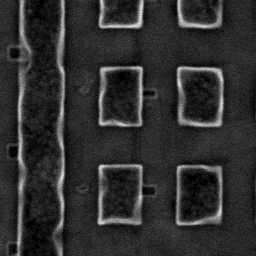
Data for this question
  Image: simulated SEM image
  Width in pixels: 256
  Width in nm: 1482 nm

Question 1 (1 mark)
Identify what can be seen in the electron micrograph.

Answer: wiring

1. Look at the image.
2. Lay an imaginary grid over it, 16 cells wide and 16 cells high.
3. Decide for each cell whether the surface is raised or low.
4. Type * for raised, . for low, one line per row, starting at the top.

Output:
.***..***..***..
.***...**...*...
.***............
..**............
.***...**..***..
.***..***..***..
.***..***..***..
.***..***...**..
.***............
.***............
.***...**..**...
.***..***..***..
.***..***..***..
.***..**...***..
.***............
.***............